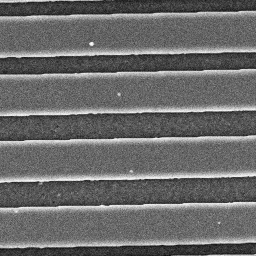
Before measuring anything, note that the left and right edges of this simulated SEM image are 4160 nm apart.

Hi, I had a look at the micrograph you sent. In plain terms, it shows lines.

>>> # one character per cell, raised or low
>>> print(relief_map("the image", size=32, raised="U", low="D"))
DDDDDDDDDDDDDDDDDDDDDDDDDDDDDDDD
DDDDDDDDDDDDDDDDDDDDDDDDDDDDDUUU
UUUUUUUUUUUUUUUUUUUUUUUUUUUUUUUU
UUUUUUUUUUUUUUUUUUUUUUUUUUUUUUUU
UUUUUUUUUUUUUUUUUUUUUUUUUUUUUUUU
UUUUUUUUUUUUUUUUUUUUUUUUUUUUUUUU
UUUUUUUUUUUUUUUUUUUUUUUUUUUDDDDD
DDDDDDDDDDDDDDDDDDDDDDDDDDDDDDDD
DDDDDDDDDDDDDDDDDDDDDDDDDDDDDDDD
UUUUUUUUUUUUUUUUUUUUUUUUUUUUUUUU
UUUUUUUUUUUUUUUUUUUUUUUUUUUUUUUU
UUUUUUUUUUUUUUUUUUUUUUUUUUUUUUUU
UUUUUUUUUUUUUUUUUUUUUUUUUUUUUUUU
UUUUUUUUUUUUUUUUUUUUUUUUUUUUUUUU
DDDDDDDDDDDDDDDDDDDDDDDDDDDDDDDD
DDDDDDDDDDDDDDDDDDDDDDDDDDDDDDDD
DDDDDDDDDDDDDDDDDDDDDDDDDDDDDDDD
DDDDDDDDUUUUUUUUUUUUUUUUUUUUUUUU
UUUUUUUUUUUUUUUUUUUUUUUUUUUUUUUU
UUUUUUUUUUUUUUUUUUUUUUUUUUUUUUUU
UUUUUUUUUUUUUUUUUUUUUUUUUUUUUUUU
UUUUUUUUUUUUUUUUUUUUUUUUUUUUUUUU
UUUUUUUUUDDDDDDDDDDDDDDDDDDDDDDD
DDDDDDDDDDDDDDDDDDDDDDDDDDDDDDDD
DDDDDDDDDDDDDDDDDDDDDDDDDDDDDDDD
DDDDDDDDDDDDDDDDDDDDDDUUUUUUUUUU
UUUUUUUUUUUUUUUUUUUUUUUUUUUUUUUU
UUUUUUUUUUUUUUUUUUUUUUUUUUUUUUUU
UUUUUUUUUUUUUUUUUUUUUUUUUUUUUUUU
UUUUUUUUUUUUUUUUUUUUUUUUUUUUUUUU
UUUUUUUUUUUUUUUUUUUUUUDDDDDDDDDD
DDDDDDDDDDDDDDDDDDDDDDDDDDDDDDDD